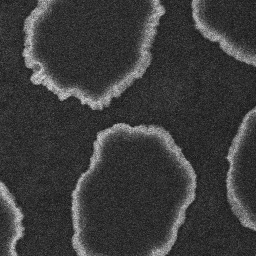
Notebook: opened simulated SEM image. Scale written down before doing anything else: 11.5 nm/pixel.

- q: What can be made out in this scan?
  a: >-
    raised bodies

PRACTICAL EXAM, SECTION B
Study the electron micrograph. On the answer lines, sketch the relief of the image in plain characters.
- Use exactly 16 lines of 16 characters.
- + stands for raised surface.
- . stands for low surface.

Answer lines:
..++++++++..++++
..++++++++..++++
..+++++++.....++
..+++++++......+
..+++++++.......
...++++.........
................
...............+
......++++.....+
......+++++...++
......++++++..++
.....+++++++..++
+....+++++++...+
+....++++++....+
+....++++++.....
+....+++++......